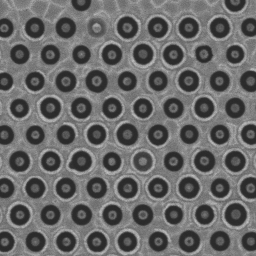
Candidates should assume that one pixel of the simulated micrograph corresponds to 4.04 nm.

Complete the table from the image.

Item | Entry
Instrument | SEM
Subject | a regular array of ring-shaped grooves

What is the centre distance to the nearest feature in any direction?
123 nanometers